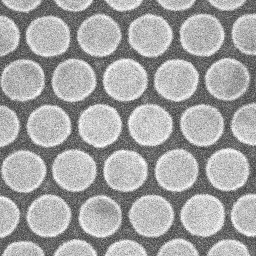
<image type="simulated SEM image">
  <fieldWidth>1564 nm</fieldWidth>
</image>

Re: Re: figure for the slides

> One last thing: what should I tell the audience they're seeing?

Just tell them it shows a regular array of raised bodies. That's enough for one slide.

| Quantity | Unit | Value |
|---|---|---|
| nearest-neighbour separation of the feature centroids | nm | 312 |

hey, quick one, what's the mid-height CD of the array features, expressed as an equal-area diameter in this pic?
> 255 nm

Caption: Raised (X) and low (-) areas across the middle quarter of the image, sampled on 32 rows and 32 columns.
XXXXXX------XXXXXXX-----XXXXXXXX
XXXXXXX----XXXXXXXXX----XXXXXXXX
XXXXXXX---XXXXXXXXXX---XXXXXXXXX
XXXXXXXX--XXXXXXXXXXX--XXXXXXXXX
XXXXXXXX--XXXXXXXXXXX--XXXXXXXXX
XXXXXXXX--XXXXXXXXXX---XXXXXXXXX
XXXXXXX----XXXXXXXXX---XXXXXXXXX
XXXXXX-----XXXXXXXX-----XXXXXXXX
XXXXX--------XXXXX--------XXXXX-
--------------------------------
--------XXX--------XXXX---------
------XXXXXX------XXXXXXX------X
-----XXXXXXXX----XXXXXXXXX----XX
X---XXXXXXXXXX--XXXXXXXXXXX--XXX
X---XXXXXXXXXX--XXXXXXXXXXX--XXX
X---XXXXXXXXXX--XXXXXXXXXXX--XXX
X---XXXXXXXXXX--XXXXXXXXXXX---XX
X---XXXXXXXXXX---XXXXXXXXX----XX
-----XXXXXXXX-----XXXXXXXX-----X
------XXXXXX------XXXXXXX-------
--------XX----------------------
-----------------------------X--
XXXXX-------XXXXXX-------XXXXXXX
XXXXXXX----XXXXXXXX-----XXXXXXXX
XXXXXXXX---XXXXXXXXX---XXXXXXXXX
XXXXXXXX--XXXXXXXXXXX--XXXXXXXXX
XXXXXXXX--XXXXXXXXXXX--XXXXXXXXX
XXXXXXXX--XXXXXXXXXXX--XXXXXXXXX
XXXXXXX---XXXXXXXXXX---XXXXXXXXX
XXXXXXX----XXXXXXXXX----XXXXXXXX
XXXXXX------XXXXXXX------XXXXXX-
-XXXX----------X-----------XX---